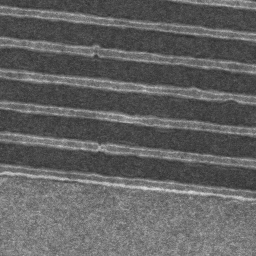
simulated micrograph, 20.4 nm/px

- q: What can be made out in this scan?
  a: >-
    parallel lines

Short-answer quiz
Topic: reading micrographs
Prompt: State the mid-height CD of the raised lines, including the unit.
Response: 175 nm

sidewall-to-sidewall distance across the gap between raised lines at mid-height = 474 nm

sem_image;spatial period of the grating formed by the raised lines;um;0.642